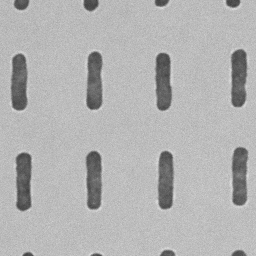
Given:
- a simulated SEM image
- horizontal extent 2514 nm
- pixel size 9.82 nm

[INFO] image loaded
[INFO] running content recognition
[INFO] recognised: a regular array of holes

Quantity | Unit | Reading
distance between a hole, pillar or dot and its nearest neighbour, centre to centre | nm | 698